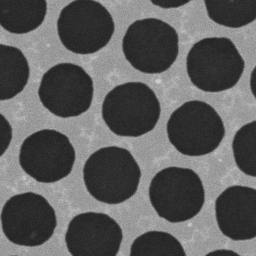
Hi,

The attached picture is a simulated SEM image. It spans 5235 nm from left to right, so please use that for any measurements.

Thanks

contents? a regular array of holes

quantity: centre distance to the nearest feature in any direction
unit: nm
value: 1370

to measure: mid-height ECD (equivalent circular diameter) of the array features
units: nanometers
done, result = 1150